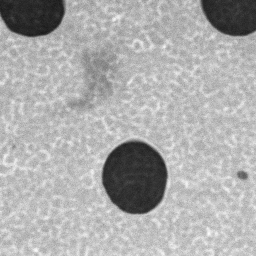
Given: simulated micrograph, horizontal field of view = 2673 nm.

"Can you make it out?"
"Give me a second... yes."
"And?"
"holes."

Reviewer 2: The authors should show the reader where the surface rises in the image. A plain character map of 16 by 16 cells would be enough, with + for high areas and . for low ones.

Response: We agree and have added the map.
....+++++++++...
....+++++++++...
++++++++++++++++
++++++++++++++++
++++++++++++++++
++++++++++++++++
++++++++++++++++
++++++++++++++++
++++++++++++++++
+++++++...++++++
++++++....++++++
++++++....++++++
+++++++...++++++
++++++++++++++++
++++++++++++++++
++++++++++++++++